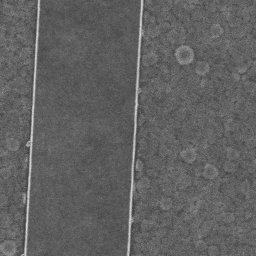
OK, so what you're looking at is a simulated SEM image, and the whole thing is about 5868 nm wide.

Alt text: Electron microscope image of one or a few lines or trenches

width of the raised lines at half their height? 2350 nm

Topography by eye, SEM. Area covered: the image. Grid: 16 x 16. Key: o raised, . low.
..ooooooo.......
..ooooooo.......
..ooooooo.......
..ooooooo..o....
..ooooooo.......
..ooooooo.......
..ooooooo.......
..oooooo........
..oooooo........
..oooooo........
..oooooo........
..oooooo........
..oooooo........
..oooooo........
..oooooo........
..oooooo........